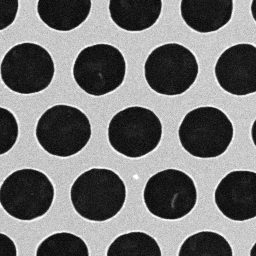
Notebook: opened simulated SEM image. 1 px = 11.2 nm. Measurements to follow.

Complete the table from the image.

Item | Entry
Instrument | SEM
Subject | holes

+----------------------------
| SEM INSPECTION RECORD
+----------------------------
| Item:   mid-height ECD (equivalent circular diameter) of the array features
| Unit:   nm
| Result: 596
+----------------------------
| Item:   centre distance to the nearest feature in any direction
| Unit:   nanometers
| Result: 799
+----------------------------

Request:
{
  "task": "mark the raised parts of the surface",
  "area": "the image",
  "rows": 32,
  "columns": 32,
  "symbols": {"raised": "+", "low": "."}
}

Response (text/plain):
..+++......+++......+++......++.
..+++......+++......+++......++.
..+++......+++......+++......+++
.+++++...++++++....+++++....++++
++++++++++++++++++++++++++++++++
++...+++++++.++++++++.++++++++.+
+.....++++.....++++.....++++....
.......++.......++.......++.....
.......++.......++.......++.....
.......++.......++.......++.....
+.....++++.....++++.....+++.....
++...++++++...++++++...+++++....
++++++++++++++++++++++++++++++++
.+++++...+++++++..+++++++..+++++
..+++......+++......+++.....++++
..+++......+++......+++......+++
..++.......+++......++.......++.
..+++......+++......++.......+++
.++++.....++++.....++++.....++++
+++++++..+++++++..++++++...+++++
++++++++++++++++++++++++++++++++
++...++++++...++++++...++++++...
+.....+++......++++.....++++....
.......++.......++......+++.....
.......++.......++.......++.....
......+++......+++......+++.....
+.....++++.....++++.....++++....
+++.+++++++..++++++++++++++++..+
++++++++++++++++++++++++++++++++
.+++++....+++++....+++++....++++
..+++......+++......+++......+++
..+++......++.......++.......++.